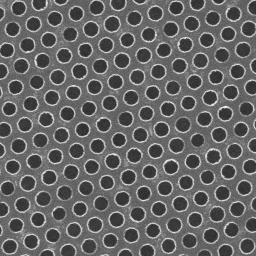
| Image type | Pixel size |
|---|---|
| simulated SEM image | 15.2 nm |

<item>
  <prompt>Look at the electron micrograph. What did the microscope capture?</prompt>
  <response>a regular array of holes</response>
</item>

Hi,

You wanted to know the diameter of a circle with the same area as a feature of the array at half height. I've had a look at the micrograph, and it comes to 212 nm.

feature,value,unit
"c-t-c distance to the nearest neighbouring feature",327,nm